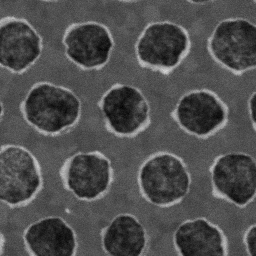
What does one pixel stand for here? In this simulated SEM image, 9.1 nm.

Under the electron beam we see holes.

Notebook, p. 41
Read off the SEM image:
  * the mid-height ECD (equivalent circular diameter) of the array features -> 46.1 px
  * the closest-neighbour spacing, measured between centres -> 0.676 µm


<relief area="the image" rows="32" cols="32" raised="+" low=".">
++++++++++++++++++++++++++++++++
++++++++++++++++++++++++++++++++
+++++++++++++++++++++++++++++.++
....+++++....++++++....++++.....
.....+++......++++.....++++.....
.....+++......+++......+++......
.....+++......+++......+++......
....+++++....+++++....+++++.....
+..++++++++++++++++++++++++++..+
++++++++++++++++++++++++++++++++
+++++.++++++++++++++++++++++++++
++++.....+++++...+++++++..++++++
+++.......+++.....+++++....++++.
+++.......+++.....++++......+++.
+++.......+++.....++++......++++
++++.....+++++....+++++.....++++
+++++++++++++++..+++++++..++++++
++++++++++++++++++++++++++++++++
+.++++++++++++++++++++++++++++++
....+++++....+++++++.+++++++...+
....+++++.....++++.....++++.....
.....+++......++++.....++++.....
.....+++......++++......+++.....
.....++++....+++++......+++.....
....++++++..++++++.....+++++....
++++++++++++++++++++.+++++++++++
++++++++++++++++++++++++++++++++
+++++...++++++...+++++++++++++++
++++.....++++.....++++.....+++++
+++......++++.....++++......+++.
+++......++++.....++++......+++.
++++.....+++++....++++......+++.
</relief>